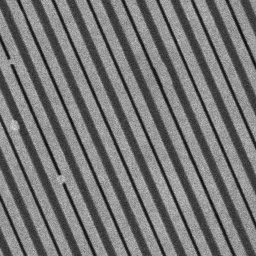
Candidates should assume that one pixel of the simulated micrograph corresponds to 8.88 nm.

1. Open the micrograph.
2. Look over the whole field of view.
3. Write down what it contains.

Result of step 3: parallel lines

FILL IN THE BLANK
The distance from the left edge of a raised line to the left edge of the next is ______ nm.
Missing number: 141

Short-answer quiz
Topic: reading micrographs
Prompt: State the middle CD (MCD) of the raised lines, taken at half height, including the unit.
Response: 99.8 nanometers